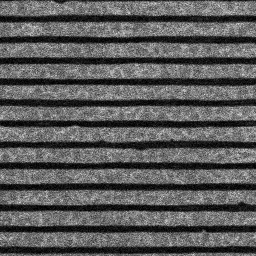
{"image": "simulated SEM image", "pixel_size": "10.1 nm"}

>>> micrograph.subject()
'parallel lines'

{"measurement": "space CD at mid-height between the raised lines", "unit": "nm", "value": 73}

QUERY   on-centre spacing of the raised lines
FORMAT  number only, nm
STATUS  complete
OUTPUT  212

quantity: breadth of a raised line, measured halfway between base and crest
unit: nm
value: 138